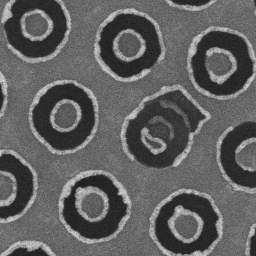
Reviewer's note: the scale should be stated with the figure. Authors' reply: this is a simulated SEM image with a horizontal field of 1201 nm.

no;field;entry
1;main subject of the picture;ring-shaped grooves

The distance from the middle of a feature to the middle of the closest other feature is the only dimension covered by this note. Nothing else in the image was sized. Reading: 423 nanometres